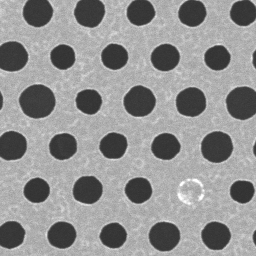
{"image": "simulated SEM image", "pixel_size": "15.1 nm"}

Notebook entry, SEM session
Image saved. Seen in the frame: a regular array of holes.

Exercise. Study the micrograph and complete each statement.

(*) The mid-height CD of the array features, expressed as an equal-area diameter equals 426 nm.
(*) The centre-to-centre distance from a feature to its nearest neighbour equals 768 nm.